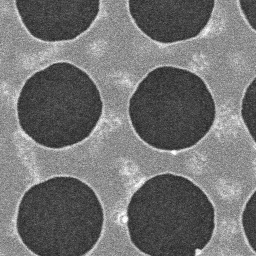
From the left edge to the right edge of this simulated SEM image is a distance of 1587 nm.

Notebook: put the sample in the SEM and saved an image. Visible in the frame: holes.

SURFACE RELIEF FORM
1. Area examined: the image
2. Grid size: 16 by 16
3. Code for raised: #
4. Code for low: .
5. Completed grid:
#.....##.....##.
#.....###....###
###.######.#####
################
##...####...####
#.....###....##.
#.....##.....##.
#.....##.....##.
##...####....###
################
################
##...####...####
#.....##.....###
#.....##.....##.
#.....##.....##.
##....###....###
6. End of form